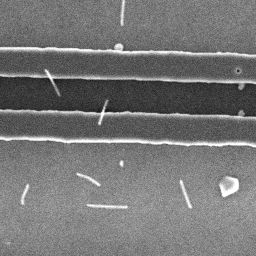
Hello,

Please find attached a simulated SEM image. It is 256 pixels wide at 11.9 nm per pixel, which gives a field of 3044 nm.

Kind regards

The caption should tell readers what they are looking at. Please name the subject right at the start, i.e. lines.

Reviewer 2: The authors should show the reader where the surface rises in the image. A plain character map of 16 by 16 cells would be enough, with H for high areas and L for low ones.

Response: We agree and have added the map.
LLLLLLLLLLLLLLLL
LLLLLLLLLLLLLLLL
LLLLLLLLLLLLLLLL
HHHHHHHHHHHHHHHH
HHHHHHHHHHHHHHHH
LLLLLLLLLLLLLLLL
LLLLLLLLLLLLLLLL
HHHHHHHHHHHHHHHH
HHHHHHHHHHHHHHHH
LLLLLLLLLLLLLLLL
LLLLLLLLLLLLLLLL
LLLLLLLLLLLLLLLL
LLLLLLLLLLLLLLLL
LLLLLLLLLLLLLLLL
LLLLLLLLLLLLLLLL
LLLLLLLLLLLLLLLL